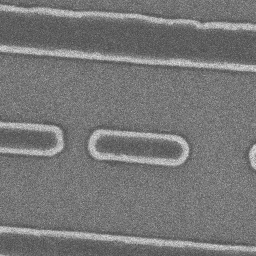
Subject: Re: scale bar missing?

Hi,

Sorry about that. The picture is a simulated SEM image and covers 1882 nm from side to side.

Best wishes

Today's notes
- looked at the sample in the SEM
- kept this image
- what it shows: one or a few lines or trenches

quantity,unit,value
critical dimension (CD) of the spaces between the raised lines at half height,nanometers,572